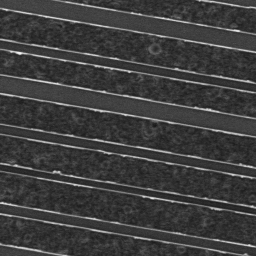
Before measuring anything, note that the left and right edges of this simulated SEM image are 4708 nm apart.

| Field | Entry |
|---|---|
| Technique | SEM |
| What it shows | parallel lines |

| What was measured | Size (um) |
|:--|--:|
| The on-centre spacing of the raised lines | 0.745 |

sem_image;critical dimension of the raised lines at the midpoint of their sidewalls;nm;569